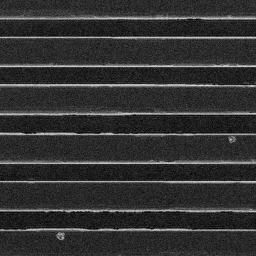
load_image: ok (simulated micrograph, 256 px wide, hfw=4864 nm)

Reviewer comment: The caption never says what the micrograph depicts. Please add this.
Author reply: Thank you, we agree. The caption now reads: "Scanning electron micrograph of lines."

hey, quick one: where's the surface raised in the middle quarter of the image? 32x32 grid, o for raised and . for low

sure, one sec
oooooooooooooooooooooooooooooooo
................................
................................
................................
................................
oooooooooooooooooooooooo.oooooo.
oooooooooooooooooooooooooooooooo
oooooooooooooooooooooooooooooooo
oooooooooooooooooooooooooooooooo
oooooooooooooooooooooooooooooooo
oooooooooooooooooooooooooooooooo
oooooooooooooooooooooooooooooooo
................................
................................
................................
................................
................................
................................
oooooooooooooooooooooooooooooooo
oooooooooooooooooooooooooooooooo
oooooooooooooooooooooooooooooooo
oooooooooooooooooooooooooooooooo
oooooooooooooooooooooooooooooooo
oooooooooooooooooooooooooooooooo
oooooooooooooooooooooooooooooooo
................................
................................
................................
................................
oooooooooooooooooooooooooooooooo
oooooooooooooooooooooooooooooooo
oooooooooooooooooooooooooooooooo